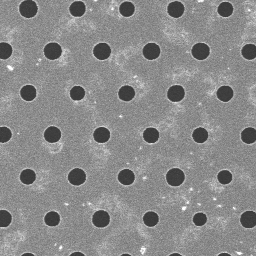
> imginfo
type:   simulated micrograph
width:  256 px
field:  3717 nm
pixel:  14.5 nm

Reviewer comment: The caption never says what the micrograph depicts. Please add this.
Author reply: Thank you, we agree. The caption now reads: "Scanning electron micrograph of a regular array of holes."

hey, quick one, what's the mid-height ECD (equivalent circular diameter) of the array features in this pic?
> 0.242 um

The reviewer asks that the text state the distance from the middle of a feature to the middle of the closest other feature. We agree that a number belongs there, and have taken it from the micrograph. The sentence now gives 48.4 px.